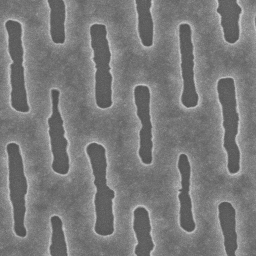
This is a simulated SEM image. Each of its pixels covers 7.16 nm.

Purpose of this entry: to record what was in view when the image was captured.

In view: a regular array of holes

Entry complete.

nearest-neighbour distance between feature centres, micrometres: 0.498